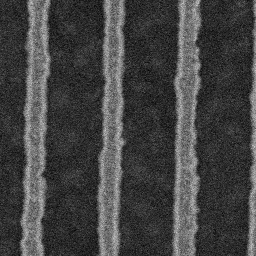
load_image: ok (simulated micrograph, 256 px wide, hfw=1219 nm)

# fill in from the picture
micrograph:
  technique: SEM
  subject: one or a few lines or trenches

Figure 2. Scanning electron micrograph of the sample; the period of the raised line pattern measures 75.5 pixels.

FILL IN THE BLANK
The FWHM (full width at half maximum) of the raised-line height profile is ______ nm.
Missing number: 65.4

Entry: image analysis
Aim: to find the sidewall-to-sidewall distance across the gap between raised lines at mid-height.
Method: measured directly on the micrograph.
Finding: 61.2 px